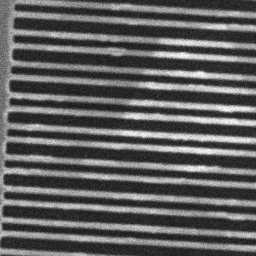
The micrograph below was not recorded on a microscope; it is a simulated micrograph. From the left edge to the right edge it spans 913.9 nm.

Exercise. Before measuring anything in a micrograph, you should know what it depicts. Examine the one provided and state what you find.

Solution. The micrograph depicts parallel lines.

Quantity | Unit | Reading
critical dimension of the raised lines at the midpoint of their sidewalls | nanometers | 17.4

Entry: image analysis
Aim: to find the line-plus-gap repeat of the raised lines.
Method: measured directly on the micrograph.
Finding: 0.0556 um